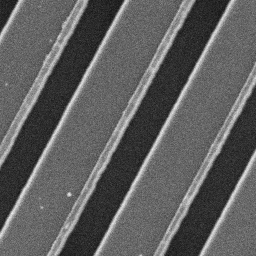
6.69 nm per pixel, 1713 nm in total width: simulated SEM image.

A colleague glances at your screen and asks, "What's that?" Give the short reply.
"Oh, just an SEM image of lines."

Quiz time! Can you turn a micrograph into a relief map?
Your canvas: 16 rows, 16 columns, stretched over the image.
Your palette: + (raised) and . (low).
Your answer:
.++++...++++..++
+++++..++++...++
++++..+++++..+++
++++..++++...+++
+++..+++++..++++
+++..++++...++++
++..+++++..++++.
+...++++..+++++.
+..++++...++++..
...++++..+++++..
..++++...++++..+
..++++..++++...+
.++++...++++..++
.++++..++++...++
++++...++++..+++
++++..++++...+++